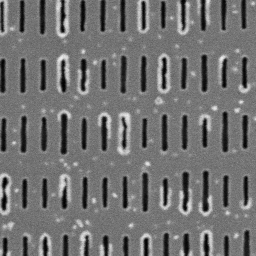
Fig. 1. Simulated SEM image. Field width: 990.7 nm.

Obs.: a regular array of holes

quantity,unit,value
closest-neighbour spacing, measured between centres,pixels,20